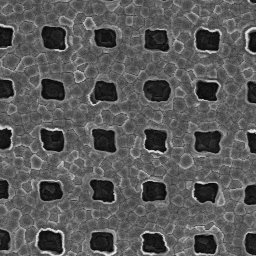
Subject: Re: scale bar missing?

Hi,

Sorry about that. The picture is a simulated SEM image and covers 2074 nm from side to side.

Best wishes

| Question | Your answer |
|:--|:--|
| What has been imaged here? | a regular array of holes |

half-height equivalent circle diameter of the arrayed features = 191 nanometers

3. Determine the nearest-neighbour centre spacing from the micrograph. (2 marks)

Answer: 410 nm